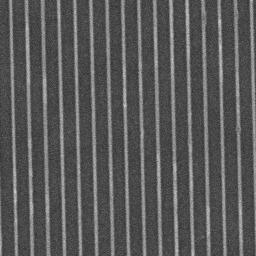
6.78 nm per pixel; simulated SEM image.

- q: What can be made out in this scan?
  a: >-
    parallel lines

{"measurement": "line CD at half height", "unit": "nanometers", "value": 19.5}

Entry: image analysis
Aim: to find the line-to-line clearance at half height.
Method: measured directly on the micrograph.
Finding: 89.8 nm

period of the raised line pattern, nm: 109